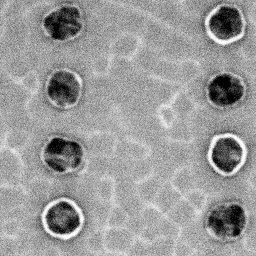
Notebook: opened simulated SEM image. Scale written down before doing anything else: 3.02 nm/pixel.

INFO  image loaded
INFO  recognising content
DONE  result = a regular array of raised bodies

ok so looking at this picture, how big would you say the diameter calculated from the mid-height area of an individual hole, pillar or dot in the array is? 116 nm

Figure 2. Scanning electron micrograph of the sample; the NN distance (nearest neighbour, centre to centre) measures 0.195 micrometres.